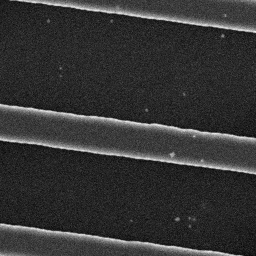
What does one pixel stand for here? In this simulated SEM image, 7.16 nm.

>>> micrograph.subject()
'lines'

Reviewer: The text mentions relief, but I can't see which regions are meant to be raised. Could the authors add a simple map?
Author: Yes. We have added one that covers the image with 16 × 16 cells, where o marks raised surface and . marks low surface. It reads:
.....ooooooooooo
............oooo
................
................
................
................
................
ooooooo.........
ooooooooooooooo.
......oooooooooo
.............ooo
................
................
................
oooo............
ooooooooooo.....